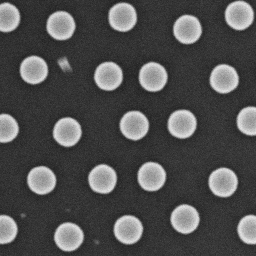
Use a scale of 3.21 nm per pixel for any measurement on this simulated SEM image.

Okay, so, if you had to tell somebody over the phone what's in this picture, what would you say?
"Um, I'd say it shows a regular array of raised bodies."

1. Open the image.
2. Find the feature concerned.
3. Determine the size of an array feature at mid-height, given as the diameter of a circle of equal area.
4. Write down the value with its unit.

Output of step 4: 89.2 nm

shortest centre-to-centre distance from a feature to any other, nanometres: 170